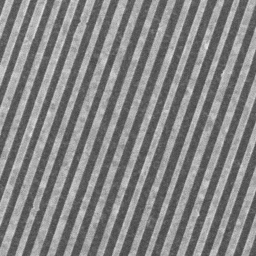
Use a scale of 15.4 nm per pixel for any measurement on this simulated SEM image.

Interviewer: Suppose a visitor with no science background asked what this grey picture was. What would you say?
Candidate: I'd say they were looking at parallel lines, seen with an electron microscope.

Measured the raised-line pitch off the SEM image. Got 0.235 um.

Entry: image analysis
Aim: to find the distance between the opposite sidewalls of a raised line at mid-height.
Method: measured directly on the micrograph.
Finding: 99.8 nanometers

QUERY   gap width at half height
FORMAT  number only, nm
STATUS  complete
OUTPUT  134